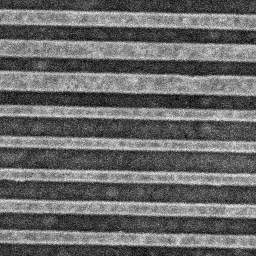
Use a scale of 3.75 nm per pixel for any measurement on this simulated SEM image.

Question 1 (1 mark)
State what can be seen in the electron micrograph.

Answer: parallel lines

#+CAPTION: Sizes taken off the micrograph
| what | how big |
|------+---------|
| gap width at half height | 72.6 nanometers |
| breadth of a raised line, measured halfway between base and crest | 42.6 nm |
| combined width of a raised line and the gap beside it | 117 nm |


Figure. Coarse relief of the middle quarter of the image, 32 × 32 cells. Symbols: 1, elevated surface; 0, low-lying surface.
00000000000000000000000000000000
00000000000000000000000000000000
10011000000000000000000000000000
11111111111111111111111111111111
11111111111111111111111111111111
11111111111111111111111111111111
11111111111111111111111111111111
00000000000000000000000000000000
00000000000000000000000000000000
00000000000000000000000000000000
00000000000000000000000000000000
11111111111111111111111111110001
11111111111111111111111111111111
00000000000000000011111111111111
00000000000000000000000000000000
00000000000000000000000000000000
00000000000000000000000000000000
00000000000000000000000000000000
00000000000000000000000000000000
11111111111111111111111111111111
11111111111111111111111111111111
00000000000000000000000000000000
00000000000000000000000000000000
00000000000000000000000000000000
00000000000000000000000000000000
00000000000000000000000000000000
00000000000000000000000000000000
11111111111111111111111111111111
11111111111111111111111111111111
00000000000000000000000111111111
00000000000000000000000000000000
00000000000000000000000000000000